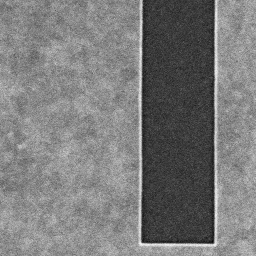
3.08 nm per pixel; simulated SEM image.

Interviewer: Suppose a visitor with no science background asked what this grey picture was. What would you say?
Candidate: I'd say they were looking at one or a few lines or trenches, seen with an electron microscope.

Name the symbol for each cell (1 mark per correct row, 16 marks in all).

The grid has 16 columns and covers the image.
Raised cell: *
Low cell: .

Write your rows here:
*********.....**
*********.....**
*********.....**
*********.....**
*********.....**
*********.....**
*********.....**
*********....***
*********....***
*********....***
*********....***
*********.....**
*********.....**
*********.....**
*********.....**
****************